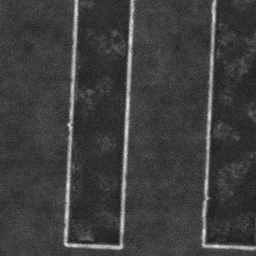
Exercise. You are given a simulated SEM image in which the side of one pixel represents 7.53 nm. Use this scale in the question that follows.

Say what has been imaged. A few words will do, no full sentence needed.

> one or a few lines or trenches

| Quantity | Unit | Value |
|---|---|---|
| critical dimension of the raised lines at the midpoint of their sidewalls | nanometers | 630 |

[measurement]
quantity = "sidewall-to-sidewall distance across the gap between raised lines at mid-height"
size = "403 nanometers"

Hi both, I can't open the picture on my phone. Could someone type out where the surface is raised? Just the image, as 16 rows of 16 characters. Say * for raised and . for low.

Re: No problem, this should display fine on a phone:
*****...*****...
*****...*****...
*****...*****...
*****...*****...
*****...*****...
*****...*****...
*****...*****...
****....*****...
****....*****...
****....*****...
****....*****...
****....*****...
****....*****...
****....*****...
****....*****...
****************